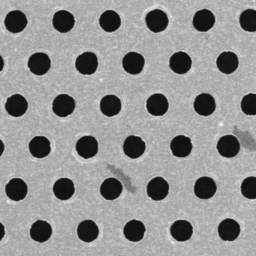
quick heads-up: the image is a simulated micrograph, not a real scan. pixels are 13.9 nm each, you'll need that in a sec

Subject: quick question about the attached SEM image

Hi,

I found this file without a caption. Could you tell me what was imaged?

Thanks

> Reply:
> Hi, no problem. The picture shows a regular array of holes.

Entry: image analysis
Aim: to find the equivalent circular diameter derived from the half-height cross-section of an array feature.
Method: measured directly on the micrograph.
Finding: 311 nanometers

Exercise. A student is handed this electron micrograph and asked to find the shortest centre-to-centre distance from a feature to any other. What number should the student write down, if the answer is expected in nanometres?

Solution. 652